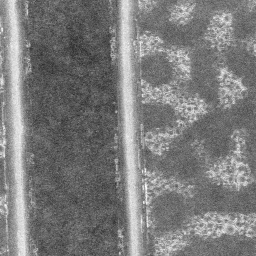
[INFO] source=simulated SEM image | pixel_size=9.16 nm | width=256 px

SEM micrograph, one or a few lines or trenches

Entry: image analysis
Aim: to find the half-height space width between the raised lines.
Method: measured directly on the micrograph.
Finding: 1020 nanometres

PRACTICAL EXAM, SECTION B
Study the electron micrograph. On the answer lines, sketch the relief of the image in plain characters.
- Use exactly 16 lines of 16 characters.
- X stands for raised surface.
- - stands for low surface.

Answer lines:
X-------XXXXXXXX
X-------XXXXXXXX
X-------XXXXXXXX
X-------XXXXXXXX
X-------XXXXXXXX
X-------XXXXXXXX
X-------XXXXXXXX
X-------XXXXXXXX
X-------XXXXXXXX
X-------XXXXXXXX
X-------XXXXXXXX
X-------XXXXXXXX
X-------XXXXXXXX
X-------XXXXXXXX
X-------XXXXXXXX
X-------XXXXXXXX